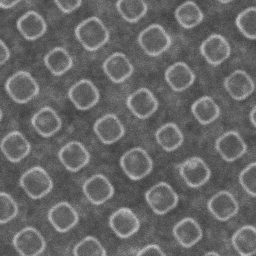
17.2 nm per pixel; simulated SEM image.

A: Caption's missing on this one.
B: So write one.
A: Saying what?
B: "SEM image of a regular array of raised bodies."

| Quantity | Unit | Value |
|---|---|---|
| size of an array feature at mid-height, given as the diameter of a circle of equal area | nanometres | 447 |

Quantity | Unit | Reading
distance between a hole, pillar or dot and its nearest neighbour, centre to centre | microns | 0.731